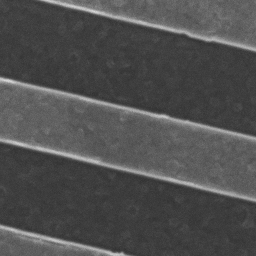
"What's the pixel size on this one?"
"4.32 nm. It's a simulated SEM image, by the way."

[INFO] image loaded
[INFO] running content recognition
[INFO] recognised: one or a few lines or trenches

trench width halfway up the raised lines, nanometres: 363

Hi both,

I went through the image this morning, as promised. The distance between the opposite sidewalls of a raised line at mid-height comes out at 267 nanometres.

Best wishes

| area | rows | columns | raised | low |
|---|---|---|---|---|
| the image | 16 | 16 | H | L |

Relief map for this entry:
LLLLLHHHHHHHHHHH
LLLLLLLLLHHHHHHH
LLLLLLLLLLLLLHHH
LLLLLLLLLLLLLLLL
LLLLLLLLLLLLLLLL
HHHLLLLLLLLLLLLL
HHHHHHHLLLLLLLLL
HHHHHHHHHHHLLLLL
HHHHHHHHHHHHHHHH
LLLHHHHHHHHHHHHH
LLLLLLLHHHHHHHHH
LLLLLLLLLLLHHHHH
LLLLLLLLLLLLLLLL
LLLLLLLLLLLLLLLL
HHLLLLLLLLLLLLLL
HHHHHHLLLLLLLLLL